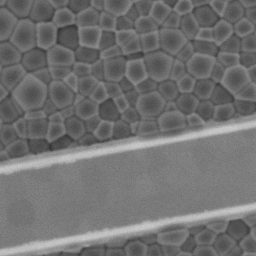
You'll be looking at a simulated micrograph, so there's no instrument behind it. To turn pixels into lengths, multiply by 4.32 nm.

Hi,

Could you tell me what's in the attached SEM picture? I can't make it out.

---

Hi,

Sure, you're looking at one or a few lines or trenches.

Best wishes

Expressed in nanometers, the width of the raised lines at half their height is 354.